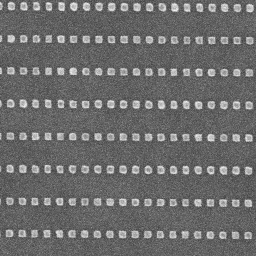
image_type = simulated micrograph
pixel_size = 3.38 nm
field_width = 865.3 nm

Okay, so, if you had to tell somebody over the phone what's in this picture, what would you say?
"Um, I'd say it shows a regular array of raised bodies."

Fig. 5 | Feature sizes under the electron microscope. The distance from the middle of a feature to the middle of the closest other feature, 41.6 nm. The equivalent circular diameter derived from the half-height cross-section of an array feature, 0.0247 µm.